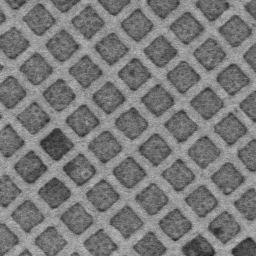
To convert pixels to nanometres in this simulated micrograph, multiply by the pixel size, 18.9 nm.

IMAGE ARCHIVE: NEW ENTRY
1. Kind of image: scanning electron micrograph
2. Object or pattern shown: a regular array of holes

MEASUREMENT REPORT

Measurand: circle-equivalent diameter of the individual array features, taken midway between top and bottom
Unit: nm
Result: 549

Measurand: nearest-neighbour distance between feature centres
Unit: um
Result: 0.652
